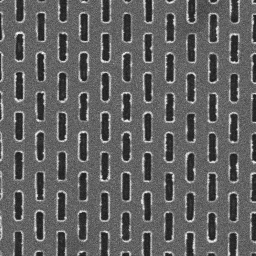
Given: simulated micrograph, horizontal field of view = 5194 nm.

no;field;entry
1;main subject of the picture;a regular array of holes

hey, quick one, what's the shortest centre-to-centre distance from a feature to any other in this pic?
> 584 nm